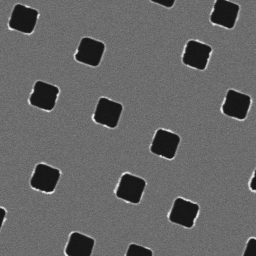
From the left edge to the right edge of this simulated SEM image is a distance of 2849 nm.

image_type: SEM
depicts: a regular array of holes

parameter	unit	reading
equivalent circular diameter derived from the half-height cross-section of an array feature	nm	305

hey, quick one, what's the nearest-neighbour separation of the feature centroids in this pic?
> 0.704 micrometres